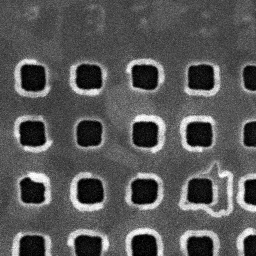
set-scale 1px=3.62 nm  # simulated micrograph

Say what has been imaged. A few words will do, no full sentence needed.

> a regular array of holes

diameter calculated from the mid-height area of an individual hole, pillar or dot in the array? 105 nm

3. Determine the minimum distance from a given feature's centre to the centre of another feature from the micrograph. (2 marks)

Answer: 55.6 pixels